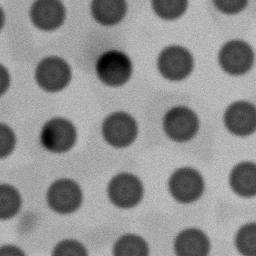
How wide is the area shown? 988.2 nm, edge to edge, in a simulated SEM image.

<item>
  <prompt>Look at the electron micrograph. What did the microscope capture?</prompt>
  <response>an array of small figures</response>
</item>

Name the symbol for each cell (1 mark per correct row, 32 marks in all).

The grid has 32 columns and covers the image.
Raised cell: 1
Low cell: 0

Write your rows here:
11110000111000001110000011100001
01110000111000001110000111100011
01110000111100011111101111111111
11111001111111111111111111111111
11111111111111111111111111111111
11111111111111111111111111110001
11111111111110011111000011100000
11111000111100001111000011100000
01110000011100000111000011110001
01110000011100001111000011111011
01111000011110001111111111111111
01111101111111111111111111111111
11111111111111111111111111111111
11111111111111111111110011110000
11111111111110001111100001110000
01111000011110000111000001110000
00111000001110000111100001111000
00111000001110000111100011111111
00111100011111001111111111111111
01111111111111111111111111111111
11111111111111111111111111111100
11111111111111111111110001111000
11111110011111000111100001111000
00111100001110000011100000111000
00011100001110000011100001111100
00011100001111000111111111111111
00111110011111111111111111111111
01111111111111111111111111111111
11111111111111111111111111111100
11111111111111100011110000111000
11111110001111000011110000111000
00011110000111000001110000111100